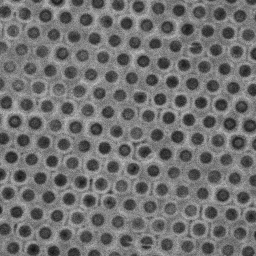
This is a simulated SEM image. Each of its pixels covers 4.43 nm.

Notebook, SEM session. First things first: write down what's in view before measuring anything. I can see a regular array of holes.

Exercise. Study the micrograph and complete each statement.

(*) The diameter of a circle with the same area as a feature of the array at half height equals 56.3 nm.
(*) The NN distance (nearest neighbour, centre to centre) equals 89.8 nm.